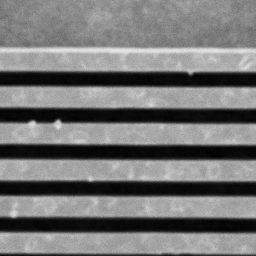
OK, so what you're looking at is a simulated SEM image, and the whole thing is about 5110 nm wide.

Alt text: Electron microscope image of parallel lines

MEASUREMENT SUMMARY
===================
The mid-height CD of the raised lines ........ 22.7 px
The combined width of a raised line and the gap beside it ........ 0.727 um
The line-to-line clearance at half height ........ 269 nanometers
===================